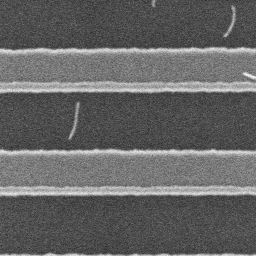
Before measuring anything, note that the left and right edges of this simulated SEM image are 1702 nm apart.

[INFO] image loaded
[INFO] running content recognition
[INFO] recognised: lines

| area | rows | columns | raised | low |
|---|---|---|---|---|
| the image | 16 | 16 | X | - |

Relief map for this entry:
----------------
----------------
----------------
XXXXXXXXXXXXXXXX
XXXXXXXXXXXXXXXX
XXXXXXXXXXXXXXXX
----------------
----------------
----------------
XXXXXXXXXXXXXXXX
XXXXXXXXXXXXXXXX
XXXXXXXXXXXXXXXX
----------------
----------------
----------------
----------------